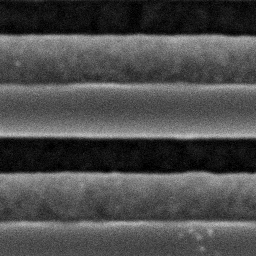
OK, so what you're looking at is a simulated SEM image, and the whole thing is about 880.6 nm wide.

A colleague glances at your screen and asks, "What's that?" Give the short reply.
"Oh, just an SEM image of lines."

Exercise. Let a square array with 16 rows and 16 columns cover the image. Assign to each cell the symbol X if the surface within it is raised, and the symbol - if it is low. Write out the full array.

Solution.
----------------
----------------
XXXXXXXXXXXXXXXX
XXXXXXXXXXXXXXXX
XXXXXXXXXXXXXXXX
XXXXXXXXXXXXXXXX
XXXXXXXXXXXXXXXX
XXXXXXXXXXXXXXXX
-----------XX---
----------------
----------------
XXXXXXXXXXXXXXXX
XXXXXXXXXXXXXXXX
XXXXXXXXXXXXXXXX
XXXXXXXXXXXXXXXX
XXXXXXXXXXXXXXXX